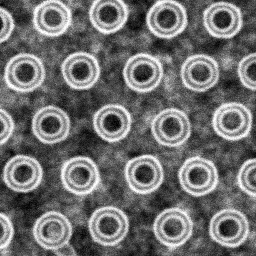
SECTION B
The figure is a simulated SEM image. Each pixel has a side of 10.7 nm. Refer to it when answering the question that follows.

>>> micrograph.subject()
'a regular array of ring-shaped raised bodies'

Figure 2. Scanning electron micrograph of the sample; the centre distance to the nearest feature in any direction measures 606 nanometers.